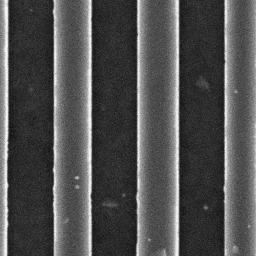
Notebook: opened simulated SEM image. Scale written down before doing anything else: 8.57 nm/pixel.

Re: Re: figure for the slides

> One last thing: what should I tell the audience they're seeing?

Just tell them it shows lines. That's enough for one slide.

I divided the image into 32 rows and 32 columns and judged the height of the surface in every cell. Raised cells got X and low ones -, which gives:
X------XXXX------XXXXX------XXXX
X------XXXX------XXXXX------XXXX
X------XXXX------XXXXX------XXXX
X------XXXX------XXXXX------XXXX
X------XXXX------XXXXX------XXXX
X------XXXX------XXXXX------XXXX
X------XXXX------XXXXX------XXXX
X------XXXX------XXXXX------XXXX
X------XXXX------XXXXX------XXXX
X------XXXX------XXXXX------XXXX
X------XXXX------XXXXX------XXXX
X------XXXX------XXXXX------XXXX
X------XXXX------XXXXX------XXXX
X------XXXX------XXXXX------XXXX
X------XXXX------XXXXX------XXXX
X------XXXX------XXXXX------XXXX
X------XXXX------XXXXX------XXXX
X------XXXX------XXXXX------XXXX
X------XXXX------XXXXX------XXXX
X------XXXX------XXXXX------XXXX
X------XXXX------XXXXX------XXXX
X------XXXX------XXXXX------XXXX
X------XXXX------XXXXX------XXXX
X------XXXX------XXXXX------XXXX
X------XXXX------XXXXX------XXXX
X------XXXX------XXXXX------XXXX
X------XXXX------XXXXX------XXXX
X------XXXX------XXXXX------XXXX
X------XXXX------XXXXX------XXXX
X------XXXX------XXXXX------XXXX
X------XXXX------XXXXX------XXXX
X------XXXX------XXXXX------XXXX